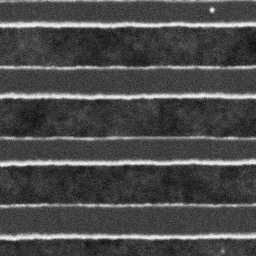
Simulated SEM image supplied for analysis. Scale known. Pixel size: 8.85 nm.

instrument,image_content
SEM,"lines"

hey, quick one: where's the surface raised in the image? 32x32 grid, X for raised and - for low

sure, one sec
XXXXXXXXXXXXXXXXXXXXXXXXXXXXXXXX
XXXXXXXXXXXXXXXXXXXXXXXXXXXXXXXX
XXXXXXXXXXXXXXXXXXXXXXXXXXXXXXXX
--------------------------------
--------------------------------
--------------------------------
--------------------------------
--------------------------------
XXXXXXXXXXXXXXXXXXXXXXXXXXXXXXXX
XXXXXXXXXXXXXXXXXXXXXXXXXXXXXXXX
XXXXXXXXXXXXXXXXXXXXXXXXXXXXXXXX
XXXXXXXXXXXXXXXXXXXXXXXXXXXXXXXX
--------------------------------
--------------------------------
--------------------------------
--------------------------------
--------------------------------
XXXXXXXXXXXXXXXXXXXXXXXXXXXXXXXX
XXXXXXXXXXXXXXXXXXXXXXXXXXXXXXXX
XXXXXXXXXXXXXXXXXXXXXXXXXXXXXXXX
XXXX-X----X--XX------------X----
--------------------------------
--------------------------------
--------------------------------
--------------------------------
--------------------------------
XXXXXXXXXXXXXXXXXXXXXXXXXXXXXXXX
XXXXXXXXXXXXXXXXXXXXXXXXXXXXXXXX
XXXXXXXXXXXXXXXXXXXXXXXXXXXXXXXX
XXXXXXXXXXXXXXXXXXXXXXXXXXXXXXXX
--------------------------------
--------------------------------